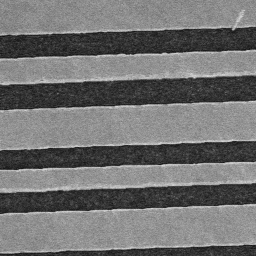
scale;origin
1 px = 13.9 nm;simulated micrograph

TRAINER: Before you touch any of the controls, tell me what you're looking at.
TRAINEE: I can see lines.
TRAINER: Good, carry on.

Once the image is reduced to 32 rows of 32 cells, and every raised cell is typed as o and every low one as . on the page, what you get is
oooooooooooooooooooooooooooooooo
oooooooooooooooooooooooooooooooo
oooooooooooooooooooooooooooooooo
ooooooooooooooooooooooo......o..
................................
................................
............................oooo
oooooooooooooooooooooooooooooooo
oooooooooooooooooooooooooooooooo
ooooooooooooooooooooo...........
................................
................................
................................
..........oooooooooooooooooooooo
oooooooooooooooooooooooooooooooo
oooooooooooooooooooooooooooooooo
oooooooooooooooooooooooooooooooo
oooooooooooooooooooooooooooooooo
oooooo..........................
................................
........................oooooooo
oooooooooooooooooooooooooooooooo
oooooooooooooooooooooooooooooooo
oooooooooo......................
................................
................................
.......ooooooooooooooooooooooooo
oooooooooooooooooooooooooooooooo
oooooooooooooooooooooooooooooooo
oooooooooooooooooooooooooooooooo
ooooooooooooooooooooooooooooooo.
ooo.............................